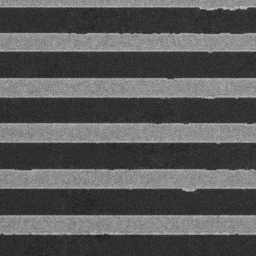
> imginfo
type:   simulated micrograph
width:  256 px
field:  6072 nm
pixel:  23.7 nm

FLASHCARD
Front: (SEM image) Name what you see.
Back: lines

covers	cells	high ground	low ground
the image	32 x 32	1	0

11111111111111111111111111111111
00000000000000000000000000000000
00000000000000000000000000000000
00000000000000000000000000000000
11111111111111111111111111111111
11111111111111111111111111111111
00000000000000000000000000000000
00000000000000000000000000000000
00000000000000000000000000000000
00000000000000000000000000000000
11111111111111111111111111111111
11111111111111111111111111111111
00000000000000000000000000000000
00000000000000000000000000000000
00000000000000000000000000000000
11111111111111111111111111111111
11111111111111111111111111111111
11111111111111111111111111111111
00000000000000000000000000000000
00000000000000000000000000000000
00000000000000000000000000000000
11111111111111111111111111111111
11111111111111111111111111111111
11111111111111111111111111111111
00000000000000000000000000000000
00000000000000000000000000000000
00000000000000000000000000000000
11111111111111111111111111111111
11111111111111111111111111111111
00000000000000000000000000000000
00000000000000000000000000000000
00000000000000000000000000000000